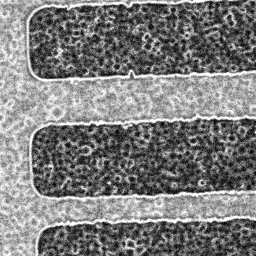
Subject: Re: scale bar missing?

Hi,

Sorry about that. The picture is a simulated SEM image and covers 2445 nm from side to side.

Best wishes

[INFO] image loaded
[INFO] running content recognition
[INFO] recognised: one or a few lines or trenches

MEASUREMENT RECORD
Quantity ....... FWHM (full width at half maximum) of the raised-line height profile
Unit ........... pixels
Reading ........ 74.3